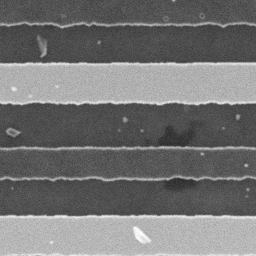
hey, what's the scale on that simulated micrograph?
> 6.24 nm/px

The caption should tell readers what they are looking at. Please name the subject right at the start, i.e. lines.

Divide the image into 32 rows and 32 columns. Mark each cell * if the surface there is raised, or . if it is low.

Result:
********************************
********************************
********************************
................................
................................
.....*..........................
................................
................................
********************************
********************************
********************************
********************************
********************************
................................
................................
................................
.*..............................
................................
******.*************************
********************************
********************************
********************************
......*......*..................
................................
................................
................................
................................
********************************
********************************
********************************
********************************
********************************